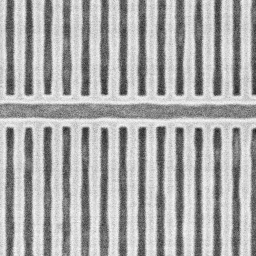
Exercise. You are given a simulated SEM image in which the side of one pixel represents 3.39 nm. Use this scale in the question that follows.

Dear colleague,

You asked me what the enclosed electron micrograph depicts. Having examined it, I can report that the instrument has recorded groups of lines, slits or small figures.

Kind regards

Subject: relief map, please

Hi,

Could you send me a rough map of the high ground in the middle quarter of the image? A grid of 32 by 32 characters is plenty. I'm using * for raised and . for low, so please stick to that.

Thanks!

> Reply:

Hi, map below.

..**...**..***..**...**..***..**
..**...**..***..**...**..***..**
..**...**..***..**...**..***..**
..**...**..***..**...**..***..**
..**...**..***..**...**..***..**
..**...**..***..**...**...**..**
..**...**..***..**...**...**..**
..**...**..***..**...**..***..**
********************************
********************************
................................
................................
................................
................................
********************************
************************.*******
..**..***..***..**...**...**..**
..**..***..***..**...**...**..**
..**..***..***..**...**..***..**
..**..***..***..**...**..***..**
..**..***..***..**...**..***..**
..**..***..***..**...**..***..**
..**...**..***..**...**..***..**
..**...**..***..**...**..***..**
..**..***..***..**...**..***..**
..**..***..***..**...**..***..**
..**..***..***..**...**..***..**
..**..***..**...**...**..***..**
..**..***..**...**...**..***..**
..**..***..***..**...**..***..**
..**...**..***..**...**..***..**
..**...**..***..**...**..***..**